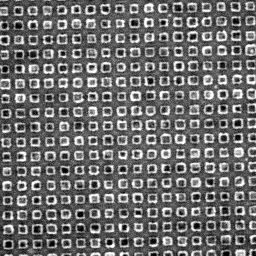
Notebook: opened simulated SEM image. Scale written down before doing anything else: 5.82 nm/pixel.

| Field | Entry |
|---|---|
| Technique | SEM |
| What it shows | a regular array of raised bodies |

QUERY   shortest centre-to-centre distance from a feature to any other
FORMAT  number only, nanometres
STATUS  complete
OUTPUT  83.1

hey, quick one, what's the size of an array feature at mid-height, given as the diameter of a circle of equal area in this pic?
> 52.6 nanometres